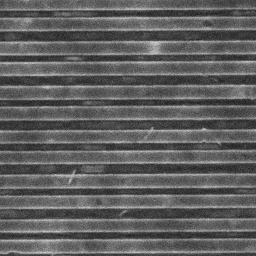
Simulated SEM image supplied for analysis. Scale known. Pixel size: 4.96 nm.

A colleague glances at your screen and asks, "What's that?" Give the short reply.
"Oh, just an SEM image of parallel lines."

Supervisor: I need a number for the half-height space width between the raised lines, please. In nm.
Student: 41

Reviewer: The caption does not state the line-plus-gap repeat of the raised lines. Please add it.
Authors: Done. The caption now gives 110 nm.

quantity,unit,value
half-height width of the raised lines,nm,65.2